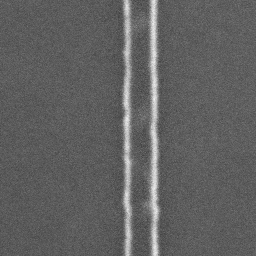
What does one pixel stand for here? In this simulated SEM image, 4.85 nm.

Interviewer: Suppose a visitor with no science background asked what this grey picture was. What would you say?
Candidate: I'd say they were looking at one or a few lines or trenches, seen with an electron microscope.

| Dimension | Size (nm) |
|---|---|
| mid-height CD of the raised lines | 139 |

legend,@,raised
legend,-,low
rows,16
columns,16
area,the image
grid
--------@@------
--------@@------
--------@@------
--------@@------
--------@@------
--------@@------
--------@@------
--------@@------
--------@@------
--------@@------
--------@@------
--------@@------
--------@@------
--------@@------
--------@@------
--------@@------